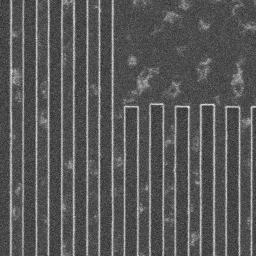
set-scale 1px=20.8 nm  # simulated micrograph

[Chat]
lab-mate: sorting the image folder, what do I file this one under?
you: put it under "parallel lines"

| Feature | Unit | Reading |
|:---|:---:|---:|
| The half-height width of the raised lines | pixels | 12.1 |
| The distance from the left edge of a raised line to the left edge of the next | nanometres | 530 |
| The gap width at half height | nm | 270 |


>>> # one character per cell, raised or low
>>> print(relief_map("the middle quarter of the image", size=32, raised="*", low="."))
**....***...********************
**....***...********************
**....***...********************
**....***...********************
**....***...*******.************
**....***...*******.************
**....***...********************
**....***...********************
**....***...********************
**....***...********************
**....***...**********...***.*.*
**....***...***....**....***...*
**....***...***....**....***...*
**....***...***....**....***...*
**....***...***....**....***...*
**....***...***....**....***...*
**....***...***....**....***...*
**....***...***....**....***...*
**....***...***....**....***...*
**....***...***....**....***...*
**....***...***....**....***...*
**....***...***....**....***...*
**....***...***....**....***...*
**....***...***....**....***...*
**....***...***....**....***...*
**....***...***....**....***...*
**....***...***....**....***...*
**....***...***....**....***...*
**....***...***....**....***...*
**....***...***....**....***...*
**....***...***....**....***...*
**....***...***....**....***...*